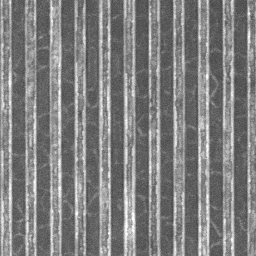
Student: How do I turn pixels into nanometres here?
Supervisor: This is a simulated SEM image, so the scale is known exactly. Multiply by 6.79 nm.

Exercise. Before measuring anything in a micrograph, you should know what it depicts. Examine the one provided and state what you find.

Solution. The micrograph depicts parallel lines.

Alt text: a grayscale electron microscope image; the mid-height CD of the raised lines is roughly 68.7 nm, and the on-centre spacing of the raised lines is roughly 168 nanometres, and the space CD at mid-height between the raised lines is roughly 14.6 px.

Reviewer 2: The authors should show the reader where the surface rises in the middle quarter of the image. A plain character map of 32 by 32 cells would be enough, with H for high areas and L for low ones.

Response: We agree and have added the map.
LLLHHLLLLHHLLLLHHHLLLHHHLLLLHHLL
LLLHHLLLLHHLLLLHHHLLLHHHLLLLHHLL
LLLHHLLLLHHLLLLHHHLLLHHHLLLLHHLL
LLLHHLLLLHHLLLLHHHLLLHHHLLLLHHLL
LLLHHLLLLHHLLLLHHHLLLHHHLLLLHHLL
LLLHHLLLLHHLLLLHHHLLLHHHLLLLHHLL
LLLHHLLLLHHLLLLHHHLLLHHHLLLLHHLL
LLLHHLLLLHHLLLLHHHLLLHHHLLLLHHLL
LLLHHLLLLHHLLLLHHHLLLHHHLLLLHHLL
LLLHHLLLLHHLLLLHHHLLLHHHLLLLHHLL
LLLHHLLLLHHLLLLHHHLLLHHHLLLLHHLL
LLLHHLLLLHHLLLLHHHLLLHHHLLLLHHLL
LLLHHLLLLHHLLLLHHHLLLHHHLLLLHHLL
LLLHHLLLLHHLLLLHHHLLLHHHLLLLHHLL
LLLHHLLLLHHLLLLHHHLLLHHHLLLLHHLL
LLLHHLLLLHHLLLLHHHLLLHHHLLLLHHLL
LLLHHLLLLHHLLLLHHHLLLHHHLLLLHHLL
LLLHHLLLLHHLLLLHHHLLLHHHLLLLHHLL
LLLHHLLLLHHLLLLHHHLLLHHHLLLLHHLL
LLLHHLLLLHHLLLLHHHLLLHHHLLLLHHLL
LLLHHLLLLHHLLLLHHHLLLHHHLLLLHHLL
LLLHHLLLLHHLLLLHHHLLLHHHLLLLHHLL
LLLHHLLLLHHLLLLHHHLLLHHHLLLLHHLL
LLLHHLLLLHHLLLLHHHLLLHHHLLLLHHLL
LLLHHLLLLHHLLLLHHHLLLHHHLLLLHHLL
LLLHHLLLLHHLLLLHHHLLLHHHLLLLHHLL
LLLHHLLLLHHLLLLHHHLLLHHHLLLLHHLL
LLLHHLLLLHHLLLLHHHLLLHHHLLLLHHLL
LLLHHLLLLHHLLLLHHHLLLHHHLLLLHHLL
LLLHHLLLLHHLLLLHHHLLLHHHLLLLHHLL
LLLHHLLLLHHLLLLHHHLLLHHHLLLLHHLL
LLLHHLLLLHHLLLLHHHLLLHHHLLLLHHLL